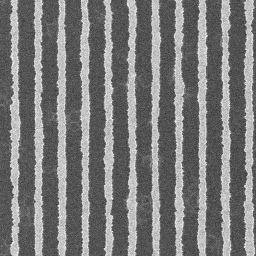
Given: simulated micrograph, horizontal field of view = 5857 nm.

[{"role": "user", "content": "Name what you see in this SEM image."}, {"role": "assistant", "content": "parallel lines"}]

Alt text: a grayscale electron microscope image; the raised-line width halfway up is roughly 143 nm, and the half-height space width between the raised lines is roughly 389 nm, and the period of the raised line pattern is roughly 23.4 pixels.